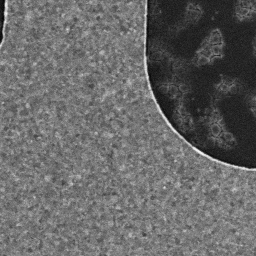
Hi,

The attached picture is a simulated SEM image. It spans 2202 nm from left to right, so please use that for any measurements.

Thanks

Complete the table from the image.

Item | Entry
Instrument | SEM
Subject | one or a few lines or trenches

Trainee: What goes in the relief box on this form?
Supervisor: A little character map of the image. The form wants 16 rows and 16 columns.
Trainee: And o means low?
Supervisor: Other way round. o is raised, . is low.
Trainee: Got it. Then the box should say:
ooooooooo.......
ooooooooo.......
ooooooooo.......
ooooooooo.......
ooooooooo.......
ooooooooo.......
oooooooooo......
oooooooooo......
ooooooooooo.....
oooooooooooo....
ooooooooooooooo.
oooooooooooooooo
oooooooooooooooo
oooooooooooooooo
oooooooooooooooo
oooooooooooooooo